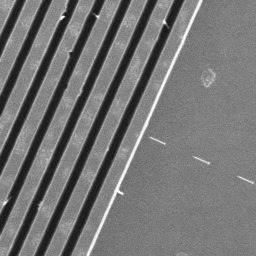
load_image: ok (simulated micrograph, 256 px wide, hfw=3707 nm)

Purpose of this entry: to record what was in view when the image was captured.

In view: parallel lines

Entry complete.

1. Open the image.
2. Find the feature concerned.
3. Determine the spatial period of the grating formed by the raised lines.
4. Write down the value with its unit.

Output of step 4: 24.2 px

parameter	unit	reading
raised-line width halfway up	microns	0.228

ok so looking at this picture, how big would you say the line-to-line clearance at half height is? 127 nm